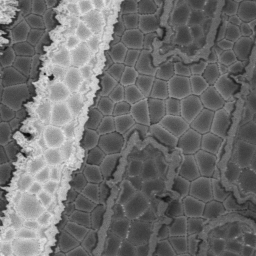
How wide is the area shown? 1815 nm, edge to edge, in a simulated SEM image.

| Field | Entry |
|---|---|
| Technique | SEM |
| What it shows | one or a few lines or trenches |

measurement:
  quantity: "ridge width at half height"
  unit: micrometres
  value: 0.364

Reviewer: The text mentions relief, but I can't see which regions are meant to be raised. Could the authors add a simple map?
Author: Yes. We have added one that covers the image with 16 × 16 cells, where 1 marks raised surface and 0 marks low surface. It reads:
1000111000111100
0000111000111100
0001111000111000
0001110000011000
0001110000000001
0011110000000001
0011110000000001
0011100000000001
0111100000000011
0011100011100011
0111100011100011
0111000111100011
1111000111000000
1111000111000000
1110001111000111
1110001111000111